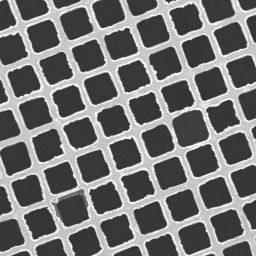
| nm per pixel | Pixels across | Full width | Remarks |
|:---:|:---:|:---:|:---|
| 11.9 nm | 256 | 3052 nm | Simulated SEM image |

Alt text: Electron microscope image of a regular array of holes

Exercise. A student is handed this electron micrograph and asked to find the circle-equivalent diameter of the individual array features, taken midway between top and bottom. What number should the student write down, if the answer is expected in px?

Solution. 30.8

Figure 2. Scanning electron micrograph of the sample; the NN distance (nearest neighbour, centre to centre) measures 0.41 µm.